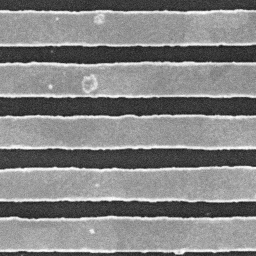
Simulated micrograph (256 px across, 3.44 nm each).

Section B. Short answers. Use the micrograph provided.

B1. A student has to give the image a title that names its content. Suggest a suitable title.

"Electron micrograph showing lines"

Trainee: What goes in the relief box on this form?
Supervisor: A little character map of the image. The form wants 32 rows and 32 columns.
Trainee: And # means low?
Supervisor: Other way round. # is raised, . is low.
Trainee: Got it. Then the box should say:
................................
########..############.#########
################################
################################
################################
################################
................................
................................
################################
################################
################################
################################
................................
................................
...............##...######......
################################
################################
################################
...##...#######...#.....########
................................
................................
################################
################################
################################
################################
................................
................................
################################
################################
################################
################################
.............#..................